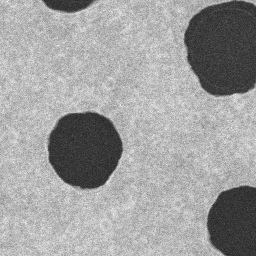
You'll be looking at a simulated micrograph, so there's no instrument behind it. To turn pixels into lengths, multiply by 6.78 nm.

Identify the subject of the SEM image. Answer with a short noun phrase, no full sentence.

holes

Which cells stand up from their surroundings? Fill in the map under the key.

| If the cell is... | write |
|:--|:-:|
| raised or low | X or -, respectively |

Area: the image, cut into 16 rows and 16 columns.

XXX--XXXXXXXX---
XXXXXXXXXXXX----
XXXXXXXXXXXX----
XXXXXXXXXXXX----
XXXXXXXXXXXX----
XXXXXXXXXXXXX---
XXXXXXXXXXXXXXXX
XXXX---XXXXXXXXX
XXX----XXXXXXXXX
XXX-----XXXXXXXX
XXX----XXXXXXXXX
XXXX--XXXXXXXXXX
XXXXXXXXXXXXX---
XXXXXXXXXXXXX---
XXXXXXXXXXXXX---
XXXXXXXXXXXXX---